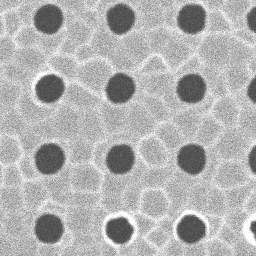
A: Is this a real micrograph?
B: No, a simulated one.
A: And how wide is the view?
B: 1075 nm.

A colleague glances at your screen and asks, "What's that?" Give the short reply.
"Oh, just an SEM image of a regular array of holes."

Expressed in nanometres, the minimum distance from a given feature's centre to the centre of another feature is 293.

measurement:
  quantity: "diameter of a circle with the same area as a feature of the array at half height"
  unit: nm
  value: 124